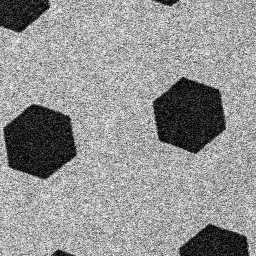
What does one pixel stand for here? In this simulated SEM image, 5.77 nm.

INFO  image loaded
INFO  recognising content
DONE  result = holes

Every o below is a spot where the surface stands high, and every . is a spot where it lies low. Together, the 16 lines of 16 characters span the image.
...ooooooooooooo
..oooooooooooooo
oooooooooooooooo
oooooooooooooooo
oooooooooooooooo
ooooooooooo..ooo
oooooooooo....oo
o...oooooo....oo
.....ooooo....oo
.....ooooooooooo
o...oooooooooooo
oooooooooooooooo
oooooooooooooooo
oooooooooooooooo
oooooooooooo...o
ooooooooooo....o